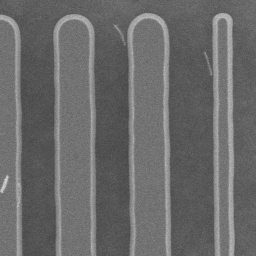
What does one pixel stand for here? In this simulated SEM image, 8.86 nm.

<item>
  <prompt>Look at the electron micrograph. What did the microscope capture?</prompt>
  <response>groups of lines, slits or small figures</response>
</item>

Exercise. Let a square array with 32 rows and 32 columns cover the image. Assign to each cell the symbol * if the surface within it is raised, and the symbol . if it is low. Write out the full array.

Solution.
................................
................................
*.......***......***.......**...
**.....****.....*****......**...
**.....****.....*****......**...
**.....*****....*****......**...
**.....*****....*****......**...
**.....****.....*****......**...
**.....****.....*****......**...
**.....*****....*****......**...
**.....*****....*****......**...
**.....*****....*****......**...
**.....*****....*****......**...
**.....*****....*****......**...
**.....*****....*****......**...
**.....*****....*****......**...
**.....*****....*****......**...
**.....*****....*****......**...
**.....*****....*****......**...
**.....*****....*****......**...
**.....*****....*****......**...
**.....*****....*****......**...
**.....*****....*****......**...
***....*****.....****......**...
***....*****.....****......**...
**.....*****.....****......**...
**.....*****....*****......**...
**.....*****.....****......**...
**.....*****.....****......**...
**.....*****.....****......**...
**.....*****.....****......**...
**.....*****.....****......**...